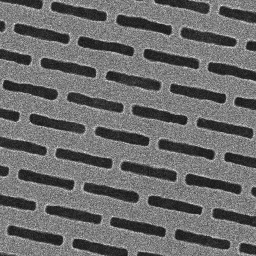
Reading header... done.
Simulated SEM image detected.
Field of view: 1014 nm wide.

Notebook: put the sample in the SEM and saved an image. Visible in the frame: a regular array of holes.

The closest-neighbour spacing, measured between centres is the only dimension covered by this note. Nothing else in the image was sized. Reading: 170 nm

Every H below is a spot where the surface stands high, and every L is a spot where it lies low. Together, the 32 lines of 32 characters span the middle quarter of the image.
LLLLLHHHHHHHHHHHHHHHHHHHHHHHLLLL
LLLLLLLLHHHHHHHHHHHHHHHHHHHHHHHH
HHHLLLLLHHHLLLLHHHHHHHHHHHHHHHHH
HHHHHHHHHHLLLLLLLLLLLLHHHHHHHHHH
HHHHHHHHHHHHHLLLLLLLLLLLHHHHHHHH
HHHHHHHHHHHHHHHHLLLLLLLLHHHLLLHH
HHHHHHHHHHHHHHHHHHHHHHLLHHLLLLLL
HLLLHHHHHHHHHHHHHHHHHHHHHHHHLLLL
HLLLLLLLLHHHHHHHHHHHHHHHHHHHHHHH
HHLLLLLLLLLLLHHHHHHHHHHHHHHHHHHH
HHHHHHLLLLLLLLLHHLLHHHHHHHHHHHHH
HHHHHHHHHHLLLLLHHLLLLLLLHHHHHHHH
HHHHHHHHHHHHHHHHHLLLLLLLLLLLHHHH
HHHHHHHHHHHHHHHHHHHHLLLLLLLLLLLH
LLHHHHHHHHHHHHHHHHHHHHHHHHLLLLLH
LLLLLHHHHHHHHHHHHHHHHHHHHHHHHHHH
LLLLLHHHLLLLHHHHHHHHHHHHHHHHHHHH
HHHHHHHHLLLLLLLLLLLHHHHHHHHHHHHH
HHHHHHHHHHLLLLLLLLLLLHHHHHHHHHHH
HHHHHHHHHHHHHHLLLLLLLHHHLLLHHHHH
HHHHHHHHHHHHHHHHHHHLLHHHLLLLLLLL
LHHHHHHHHHHHHHHHHHHHHHHHLLLLLLLL
LLLLLLHHHHHHHHHHHHHHHHHHHHHHHHLL
LLLLLLLLLLLHHHHHHHHHHHHHHHHHHHHH
HHHHLLLLLLLLHHHLLHHHHHHHHHHHHHHH
HHHHHHHHLLLLHHLLLLLLLHHHHHHHHHHH
HHHHHHHHHHHHHHHLLLLLLLLLLLHHHHHH
HHHHHHHHHHHHHHHHHHLLLLLLLLLLHHHL
HHHHHHHHHHHHHHHHHHHHHHHLLLLLHHLL
LLLHHHHHHHHHHHHHHHHHHHHHHHHHHHLL
LLLHHLLLLLLHHHHHHHHHHHHHHHHHHHHH
HHHHHLLLLLLLLLLHHHHHHHHHHHHHHHHH